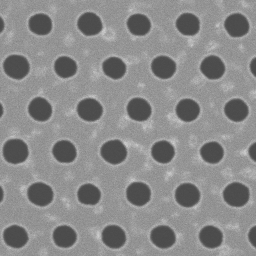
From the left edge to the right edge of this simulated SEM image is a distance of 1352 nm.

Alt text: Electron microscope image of a regular array of holes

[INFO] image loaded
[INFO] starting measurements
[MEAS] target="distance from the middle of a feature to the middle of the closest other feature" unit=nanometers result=256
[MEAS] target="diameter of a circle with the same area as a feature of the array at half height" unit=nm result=123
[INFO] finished